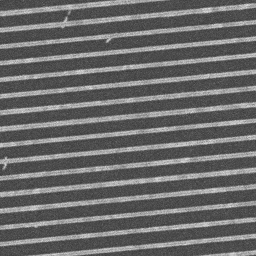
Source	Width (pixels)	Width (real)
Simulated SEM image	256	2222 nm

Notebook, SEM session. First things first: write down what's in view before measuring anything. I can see parallel lines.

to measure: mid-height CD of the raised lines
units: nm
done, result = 25.9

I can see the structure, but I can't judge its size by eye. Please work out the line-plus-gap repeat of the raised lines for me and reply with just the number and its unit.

16.4 px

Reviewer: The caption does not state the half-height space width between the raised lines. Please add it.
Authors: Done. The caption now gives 118 nm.